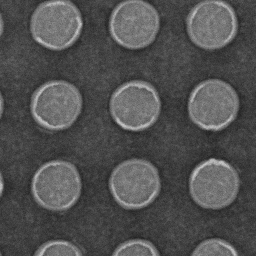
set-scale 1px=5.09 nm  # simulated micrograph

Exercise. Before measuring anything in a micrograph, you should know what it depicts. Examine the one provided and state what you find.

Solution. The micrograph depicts raised bodies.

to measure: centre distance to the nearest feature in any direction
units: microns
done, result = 0.399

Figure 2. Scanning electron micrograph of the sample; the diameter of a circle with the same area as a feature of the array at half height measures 246 nm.